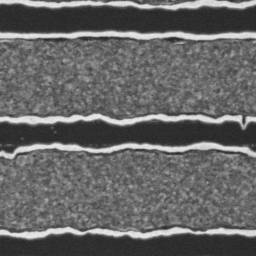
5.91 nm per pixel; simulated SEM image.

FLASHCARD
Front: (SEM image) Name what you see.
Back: one or a few lines or trenches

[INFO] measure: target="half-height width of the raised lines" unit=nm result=182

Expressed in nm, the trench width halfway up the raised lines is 494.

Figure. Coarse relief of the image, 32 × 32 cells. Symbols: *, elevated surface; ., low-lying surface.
******..*********........****..*
********************************
********************************
********************************
.......................*****....
................................
................................
................................
................................
................................
................................
................................
................................
................................
................................
********************************
********************************
********************************
****......****......***.....****
................................
................................
................................
................................
................................
................................
................................
................................
................................
................................
********************************
********************************
********************************